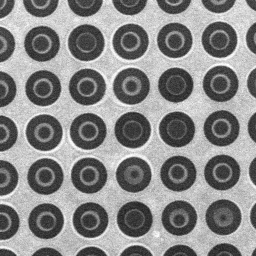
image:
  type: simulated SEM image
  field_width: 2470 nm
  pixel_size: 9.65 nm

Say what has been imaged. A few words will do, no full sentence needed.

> an array of small figures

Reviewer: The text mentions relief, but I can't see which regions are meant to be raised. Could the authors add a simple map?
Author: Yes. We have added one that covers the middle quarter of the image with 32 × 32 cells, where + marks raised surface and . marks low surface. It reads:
++++++++++++++++.+++++++++++++++
++++....++++++.....+++++++.....+
++.......++++.......++++........
++........++.........+++..++++..
+...+++....+...+++....+...++++..
+...++++.......++++...+...++++..
+...++++.......++++...++..++++..
+...+++....+....+....+++........
++........++.........++++......+
+++......++++......++++++++..+++
+++++..+++++++++.+++++++++++++++
++++++++++++++++++++++++++++++++
+++++...+++++++.....+++++......+
+++......+++++.......+++........
++........+++...++....++...+++..
+...++++...++..++++...+...++++..
+...++++...+...++++...+...+++++.
+...++++...++..++++...++..++++..
+....++...+++...++....++...++...
++........++++.......++++.......
++.......++++++.....++++++....++
++++...++++++++++.++++++++++++++
++++++++++++++++++++++++++++++++
++++....+++++++.....++++++.....+
+++.......++++.......++++.......
++........+++.........++...+++..
++...+++...++...+++...++...+++..
+...++++...++...+++...++...+++..
++..++++...++...+++...++...+++..
++...+++...++.........++........
++........++++.......++++.......
+++......++++++.....++++++.....+